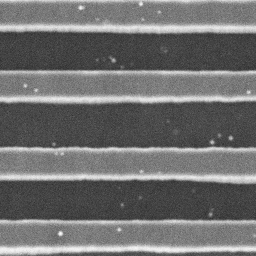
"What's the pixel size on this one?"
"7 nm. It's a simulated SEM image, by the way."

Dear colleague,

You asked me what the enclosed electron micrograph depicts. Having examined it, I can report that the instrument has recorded lines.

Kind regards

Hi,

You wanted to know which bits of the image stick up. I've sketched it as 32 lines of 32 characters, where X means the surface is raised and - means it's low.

XXXXXXXXXXXXXXXXXXXXXXXXXXXXXXXX
XXXXXXXXXXXXXXXXXXXXXXXXXXXXXXXX
XXXXXXXXXXXXXXXXXXXXXXXXXXXXXXXX
XXXXXXXXXXXXXXXXXXXXXXXXXXXXXXXX
--------------------------------
--------------------------------
--------------------------------
--------------------------------
--------------------------------
XXXXXXXXXXXXXXXXXXXXXXXXXXXXXXXX
XXXXXXXXXXXXXXXXXXXXXXXXXXXXXXXX
XXXXXXXXXXXXXXXXXXXXXXXXXXXXXXXX
--------------------------------
--------------------------------
--------------------------------
--------------------------------
--------------------------------
--------------------------------
XXX-----XXX---------------XX----
XXXXXXXXXXXXXXXXXXXXXXXXXXXXXXXX
XXXXXXXXXXXXXXXXXXXXXXXXXXXXXXXX
XXXXXXXXXXXXXXXXXXXXXXXXXXXXXXXX
--------------------------------
--------------------------------
--------------------------------
--------------------------------
--------------------------------
--------------------------------
XXXXXXXXXXXXXXXXXXXXXXXXXXXXXXXX
XXXXXXXXXXXXXXXXXXXXXXXXXXXXXXXX
XXXXXXXXXXXXXXXXXXXXXXXXXXXXXXXX
--------------------------------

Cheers